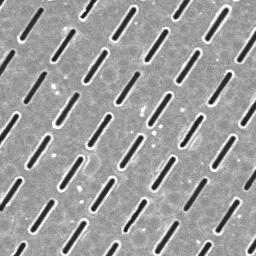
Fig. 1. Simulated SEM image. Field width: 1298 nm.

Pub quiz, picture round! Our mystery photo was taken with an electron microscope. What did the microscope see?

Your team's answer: a regular array of holes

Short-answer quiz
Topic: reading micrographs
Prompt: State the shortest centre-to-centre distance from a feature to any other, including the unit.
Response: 196 nm